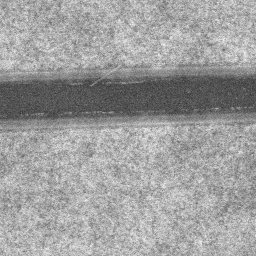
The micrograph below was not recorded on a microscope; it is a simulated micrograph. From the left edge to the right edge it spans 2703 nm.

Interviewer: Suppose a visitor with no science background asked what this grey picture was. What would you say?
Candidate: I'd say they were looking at one or a few lines or trenches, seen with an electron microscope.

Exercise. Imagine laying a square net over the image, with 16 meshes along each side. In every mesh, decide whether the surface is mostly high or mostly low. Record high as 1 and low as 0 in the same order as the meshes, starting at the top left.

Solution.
1111111111111111
1111111111111111
1111111111111111
1111111111111111
1111111111000000
0000000000000000
0000000000000000
0000000000111111
1111111111111111
1111111111111111
1111111111111111
1111111111111111
1111111111111111
1111111111111111
1111111111111111
1111111111111111